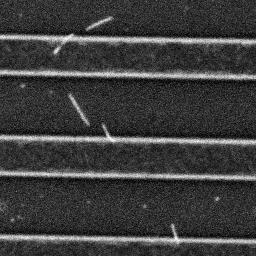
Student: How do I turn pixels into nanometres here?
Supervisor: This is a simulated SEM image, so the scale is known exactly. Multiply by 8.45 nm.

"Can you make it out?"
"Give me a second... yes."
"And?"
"one or a few lines or trenches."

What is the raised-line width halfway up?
303 nm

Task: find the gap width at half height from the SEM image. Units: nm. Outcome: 539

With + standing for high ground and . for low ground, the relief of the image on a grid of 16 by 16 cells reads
................
................
++++++++........
++++++++++++++++
++++++++++++++++
................
................
................
................
++++++++++++++++
++++++++++++++++
................
................
................
................
++++++++++++++++